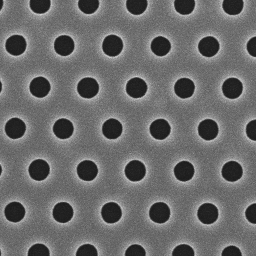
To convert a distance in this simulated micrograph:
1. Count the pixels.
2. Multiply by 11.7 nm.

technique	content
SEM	a regular array of holes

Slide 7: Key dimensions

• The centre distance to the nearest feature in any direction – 562 nm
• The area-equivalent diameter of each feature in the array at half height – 251 nm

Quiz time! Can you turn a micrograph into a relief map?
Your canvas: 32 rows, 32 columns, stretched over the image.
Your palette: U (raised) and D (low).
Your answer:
UUUUDDUUUUDDUUUUDDUUUUDDUUUUDDUU
UUUUDDUUUUDDUUUUDDUUUUDDUUUUDDUU
UUUUUUUUUUUUUUUUUUUUUUUUUUUUUUUU
UUUUUUUUUUUUUUUUUUUUUUUUUUUUUUUU
UDDUUUUUUUUUUDDUUUUUUUUUUUUUUUUU
UDDUUUUDDUUUUDDUUUUDDUUUUDDUUUUD
UDDUUUUDDUUUUDDUUUUDDUUUUDDUUUUD
UUUUUUUUUUUUUUUUUUUUUUUUUUUUUUUU
UUUUUUUUUUUUUUUUUUUUUUUUUUUUUUUU
UUUUUUUUUUUUUUUUUUUUUUUUUUUUUUUU
UUUUDDUUUUDDUUUUDDUUUUDDUUUUDDUU
UUUUDDUUUUDDUUUUDDUUUUDDUUUUDDUU
UUUUUUUUUUUUUUUUUUUUUUUUUUUUUUUU
UUUUUUUUUUUUUUUUUUUUUUUUUUUUUUUU
UUUUUUUUUUUUUUUUUUUUUUUUUUUUUUUU
UDDUUUUDDUUUUDDUUUUDDUUUUDDUUUUD
UDDUUUUDDUUUUDDUUUUDDUUUUDDUUUUD
UUUUUUUUUUUUUUUUUUUUUUUUUUUUUUUD
UUUUUUUUUUUUUUUUUUUUUUUUUUUUUUUU
UUUUUUUUUUUUUUUUUUUUUUUUUUUUUUUU
UUUUDDUUUUDDUUUUDDUUUUDDUUUUDDUU
UUUUDDUUUUDDUUUUDDUUUUDDUUUUDDUU
UUUUDUUUUUDDUUUUDDUUUUDDUUUUDDUU
UUUUUUUUUUUUUUUUUUUUUUUUUUUUUUUU
UUUUUUUUUUUUUUUUUUUUUUUUUUUUUUUU
UDDUUUUDDUUUUDDUUUUDDUUUUDDUUUUU
UDDUUUUDDUUUUDDUUUUDDUUUUDDUUUUD
UDDUUUUDDUUUUDDUUUUDDUUUUDDUUUUD
UUUUUUUUUUUUUUUUUUUUUUUUUUUUUUUU
UUUUUUUUUUUUUUUUUUUUUUUUUUUUUUUU
UUUUDUUUUUUUUUUUUUUUUUUUUUUUUUUU
UUUDDDUUUUDDUUUUDDUUUUDDUUUUDDUU